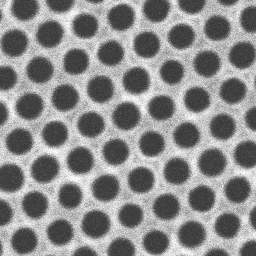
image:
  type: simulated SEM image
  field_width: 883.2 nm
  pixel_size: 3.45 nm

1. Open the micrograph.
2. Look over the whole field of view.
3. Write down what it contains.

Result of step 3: a regular array of holes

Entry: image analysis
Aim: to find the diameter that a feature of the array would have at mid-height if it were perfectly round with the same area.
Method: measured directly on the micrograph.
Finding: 89.4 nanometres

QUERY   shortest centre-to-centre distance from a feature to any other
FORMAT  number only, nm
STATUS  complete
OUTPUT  126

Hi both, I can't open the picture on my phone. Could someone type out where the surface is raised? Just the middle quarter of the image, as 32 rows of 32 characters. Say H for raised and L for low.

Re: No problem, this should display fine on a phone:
LLLLLLHHHHHHHHHHHHHHHHHHLLLLLLHH
LLLLLHHHHHHHHHHHLLLLHHHHLLLLLLHH
HLLLHHHHHHHHHHHLLLLLLHHHLLLLLLHH
HHHHHHHLLLLHHHHLLLLLLHHHLLLLLLHH
HHHHHHLLLLLLHHHLLLLLLHHHHLLLLHHH
LLHHHHLLLLLLHHHLLLLLLHHHHHHHHHHH
LLLHHHLLLLLLHHHHLLLLHHHHHHHHHHHL
LLLHHHLLLLLLHHHHHHHHHHHHHHHHHHLL
LLLLHHHLLLLLHHHHHHHHHHHLLLHHHHLL
LLLHHHHHLLHHHHHHHHHHHHLLLLLHHHLL
LLLHHHHHHHHHHLLLLLHHHLLLLLLHHHHL
LHHHHHHHHHHHHLLLLLLHHLLLLLLHHHHL
HHHHHLLLHHHHLLLLLLLHHLLLLLLHHHHH
HHHHLLLLLHHHLLLLLLLHHHLLLLHHHHHH
HHHHLLLLLLHHLLLLLLLHHHHHHHHHHHHH
HHHLLLLLLLHHHLLLLLHHHHHHHHHHHLLL
LHHHLLLLLLHHHHHLHHHHHHHHHHHHLLLL
LHHHHLLLLHHHHHHHHHHHLLLLHHHLLLLL
LHHHHHHHHHHHHHHHHHHLLLLLLHHLLLLL
HHHHHHHHHHHLLLLHHHHLLLLLLHHHLLLL
HHHHHHHHHHLLLLLLHHHLLLLLLHHHHLLL
HHLLLLHHHHLLLLLLHHHLLLLLLHHHHHHH
HLLLLLLHHHLLLLLLHHHHLLLLHHHHHHHH
HLLLLLLHHHLLLLLLHHHHHHHHHHHHHHHH
HLLLLLLHHHHLLLLHHHHHHHHHHHLLLLHH
HLLLLLLHHHHHHHHHHHHHHHHHHLLLLLLH
HHLLLLHHHHHHHHHHHLLLLHHHHLLLLLLH
HHHHHHHHHHHHHHHHLLLLLLHHHLLLLLLH
HHHHHHHHHLLLLHHHLLLLLLHHHLLLLLLH
HHHHHHHLLLLLLHHHLLLLLLHHHHLLLLHH
LLLHHHHLLLLLLLHHLLLLLLHHHHHHHHHH
LLLLHHHLLLLLLLHHHLLLLHHHHHHHHHHH